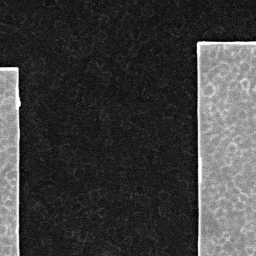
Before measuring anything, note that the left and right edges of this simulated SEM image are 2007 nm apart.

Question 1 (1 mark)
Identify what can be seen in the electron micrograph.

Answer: one or a few lines or trenches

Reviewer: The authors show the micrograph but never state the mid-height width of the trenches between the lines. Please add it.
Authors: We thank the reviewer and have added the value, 1410 nm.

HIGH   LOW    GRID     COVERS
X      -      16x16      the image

----------------
----------------
----------------
------------XXXX
X-----------XXXX
X-----------XXXX
X-----------XXXX
X-----------XXXX
X-----------XXXX
X-----------XXXX
X-----------XXXX
X-----------XXXX
X-----------XXXX
X-----------XXXX
X-----------XXXX
X-----------XXXX